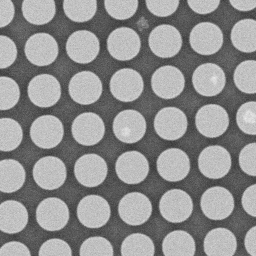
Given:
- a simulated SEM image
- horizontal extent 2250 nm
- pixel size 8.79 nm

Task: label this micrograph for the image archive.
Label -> an array of small figures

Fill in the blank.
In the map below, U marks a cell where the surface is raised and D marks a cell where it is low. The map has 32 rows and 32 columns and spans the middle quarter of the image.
DDDDDDDDDDDDDDDDDDDDDDDDDDDDDDDD
DDDDDDDDDDDDDDUUUDDDDDDUUUUUUDDD
DDDUUUUDDDDDDUUUUUUDDDUUUUUUUDDD
DDUUUUUUDDDDUUUUUUUDDDUUUUUUUUDD
DDUUUUUUUDDDUUUUUUUUDDUUUUUUUUDD
DUUUUUUUUDDDUUUUUUUUDDUUUUUUUUDD
DUUUUUUUUDDDUUUUUUUUDDUUUUUUUUDD
DUUUUUUUUDDDUUUUUUUDDDDUUUUUUDDD
DDUUUUUUUDDDDUUUUUDDDDDDDUUDDDDD
DDDUUUUDDDDDDDDDDDDDDDDDDDDDDDDD
DDDDDDDDDDDDDDDDDDDDDDDDDDDDDDDD
DDDDDDDDDDDDDDDDDDDDDDDDUUUUUDDD
DDDDDUUUDDDDDDUUUUUDDDDUUUUUUUDD
DDDUUUUUUDDDDUUUUUUUDDDUUUUUUUDD
DDUUUUUUUUDDDUUUUUUUDDDUUUUUUUUD
DDUUUUUUUUDDUUUUUUUUDDDUUUUUUUUD
DDUUUUUUUUDDUUUUUUUUDDDUUUUUUUDD
DDUUUUUUUUDDDUUUUUUUDDDDUUUUUUDD
DDDUUUUUUDDDDUUUUUUDDDDDDUUUUDDD
DDDUUUUUDDDDDDDUUUDDDDDDDDDDDDDD
DDDDDDDDDDDDDDDDDDDDDDDDDDDDDDDD
DDDDDDDDDDDDDDDDDDDDDDDDDDUUUDDD
DDDDDDDDDDDDDDDUUUUDDDDDUUUUUUDD
DDDDUUUUUDDDDDUUUUUUDDDDUUUUUUUD
DDDUUUUUUUDDDUUUUUUUUDDUUUUUUUUD
DDDUUUUUUUUDDUUUUUUUUDDUUUUUUUUD
DDDUUUUUUUUDDUUUUUUUUDDUUUUUUUUD
DDDUUUUUUUUDDUUUUUUUUDDDUUUUUUUD
DDDUUUUUUUDDDDUUUUUUDDDDDUUUUUDD
DDDDUUUUUDDDDDDUUUUDDDDDDDDDDDDD
DDDDDUUUDDDDDDDDDDDDDDDDDDDDDDDD
DDDDDDDDDDDDDDDDDDDDDDDDDDDUUDDD